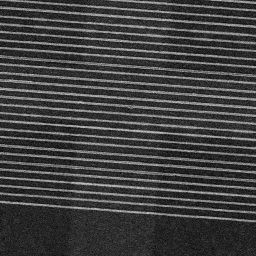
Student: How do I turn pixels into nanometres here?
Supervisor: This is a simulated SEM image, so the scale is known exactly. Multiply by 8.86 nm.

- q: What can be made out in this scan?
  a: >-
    parallel lines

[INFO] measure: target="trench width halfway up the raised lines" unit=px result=6.11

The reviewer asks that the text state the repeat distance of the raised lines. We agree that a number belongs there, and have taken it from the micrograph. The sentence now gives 71.6 nanometers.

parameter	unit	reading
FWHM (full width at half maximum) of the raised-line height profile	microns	0.0144